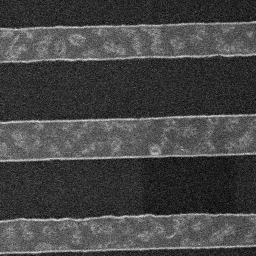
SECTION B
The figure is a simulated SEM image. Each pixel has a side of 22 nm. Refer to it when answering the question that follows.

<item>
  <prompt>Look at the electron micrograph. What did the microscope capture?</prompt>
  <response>one or a few lines or trenches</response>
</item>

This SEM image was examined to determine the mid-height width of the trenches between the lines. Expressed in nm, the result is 1320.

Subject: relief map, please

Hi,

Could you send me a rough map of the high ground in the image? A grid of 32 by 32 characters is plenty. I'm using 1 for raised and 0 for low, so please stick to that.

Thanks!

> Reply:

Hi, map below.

00000000000000000000000000000000
00000000000000000000000000000000
00000000000000000000000000000000
00001101111111111111111111111111
11111111111111111111111111111111
11111111111111111111111111111111
11111111111111111111111111111111
11111000000000000000000000000000
00000000000000000000000000000000
00000000000000000000000000000000
00000000000000000000000000000000
00000000000000000000000000000000
00000000000000000000000000000000
00000000000000000000000000000000
00000000000000000000000000100111
11111111111111111111111111111111
11111111111111111111111111111111
11111111111111111111111111111111
11111111111111111111111111111111
11111111111111111111100000000000
00000000000000000000000000000000
00000000000000000000000000000000
00000000000000000000000000000000
00000000000000000000000000000000
00000000000000000000000000000000
00000000000000000000000000000000
00000000000000000000000000000000
00110011111111111111111111111111
11111111111111111111111111111111
11111111111111111111111111111111
11111111111111111111111111111111
11111000000000000000000000000000